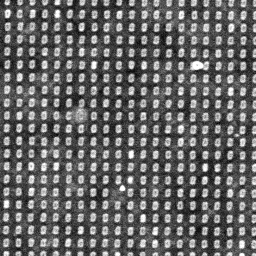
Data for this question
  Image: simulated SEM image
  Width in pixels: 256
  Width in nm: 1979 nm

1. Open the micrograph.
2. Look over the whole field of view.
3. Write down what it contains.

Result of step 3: a regular array of raised bodies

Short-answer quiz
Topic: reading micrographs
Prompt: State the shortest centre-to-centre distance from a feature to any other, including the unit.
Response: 94.1 nm